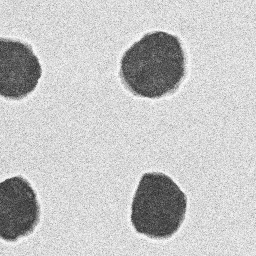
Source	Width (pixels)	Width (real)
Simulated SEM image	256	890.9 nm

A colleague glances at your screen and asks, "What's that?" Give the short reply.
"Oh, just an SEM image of holes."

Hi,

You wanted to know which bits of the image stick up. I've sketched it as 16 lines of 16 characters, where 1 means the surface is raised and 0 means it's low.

1111111111111111
1111111111111111
0111111110011111
0011111100001111
0001111100001111
0011111100011111
1111111111111111
1111111111111111
1111111111111111
1111111111111111
1111111111111111
0011111110011111
0011111100001111
0011111100001111
0011111110011111
1111111111111111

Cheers